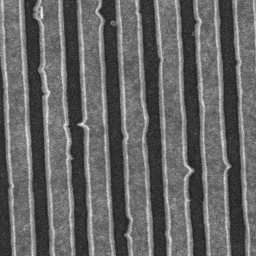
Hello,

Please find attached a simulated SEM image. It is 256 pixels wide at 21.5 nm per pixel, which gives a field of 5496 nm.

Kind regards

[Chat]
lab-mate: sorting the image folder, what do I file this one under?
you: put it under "parallel lines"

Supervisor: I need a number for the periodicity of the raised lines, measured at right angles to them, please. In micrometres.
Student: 0.836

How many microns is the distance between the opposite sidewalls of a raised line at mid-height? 0.456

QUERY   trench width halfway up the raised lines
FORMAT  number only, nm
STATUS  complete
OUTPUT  381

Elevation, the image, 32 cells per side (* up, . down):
***..***..***..**...**..***..***
***.****..**...**...**..***..***
***..***..***..**...**...**..***
***..***..***..**...**...**..***
***..***..***..**...**...**...**
***..***..***..***..***..**...**
***..***..***..***..***..**...**
***..***..***..***..***..**...**
.**..***..***..***..***..***..**
.**..***..***..***..***..***..**
.**...**..***..***..***..***..**
.**...**..***..***..***..***..**
.**...**..***..***..***..***..**
.**...**...**..***..***..***..**
.**...**...**..***..***..***..**
.**...**..***..***..***..***..**
.***..**...**...**..***..***..**
.***..***..**...**..***..***..**
.***..***..**...**..***..***..**
.***..***..**...**..***..***..**
.***..***..**...**...**...**..**
.***..***..**...**...***..**..**
.***..***..***..**...**...**..**
.***..***..***..**...**...**...*
.***..***..***..***..**...**..**
.***..***..***..***..**...**..**
.***..***..***..***..**...**...*
..**..***..***..***..***..**...*
..**..***..***..***..***..**...*
..**...**..***..***..***..**...*
..**..***..***..***..***..***..*
..**..***..***..***..***..***..*